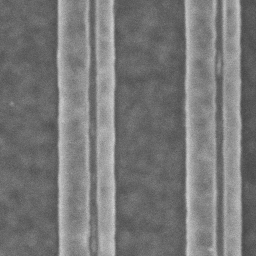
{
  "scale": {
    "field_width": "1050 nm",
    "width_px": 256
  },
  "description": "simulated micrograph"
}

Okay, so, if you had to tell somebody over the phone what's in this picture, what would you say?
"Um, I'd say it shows lines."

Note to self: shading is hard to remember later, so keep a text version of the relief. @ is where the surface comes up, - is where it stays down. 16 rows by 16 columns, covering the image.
----@@@-----@@@-
----@@@-----@@@-
----@@@-----@@@-
----@@@-----@@@-
----@@@-----@@@-
----@@@-----@@@-
----@@@-----@@@-
----@@@-----@@@-
----@@@-----@@@-
----@@@-----@@@-
----@@@-----@@@-
----@@@-----@@@-
----@@@-----@@@-
----@@@-----@@@-
----@@@-----@@@-
----@@@-----@@@-